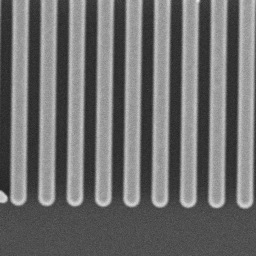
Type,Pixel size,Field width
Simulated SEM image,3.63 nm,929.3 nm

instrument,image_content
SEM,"groups of lines, slits or small figures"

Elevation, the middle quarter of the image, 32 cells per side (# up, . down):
.####...####...####....###....##
.####...####...####....###....##
.####...####...####...####....##
.####...####...####...####....##
.####...####...####...####....##
.####...####...####...####....##
.####...####...####...####....##
.####...####...####...####....##
.####...####...####...####...###
.####...####...####...####...###
.####...####...####...####...###
.####...####...####...####...###
.####...####...####...####...###
.####...####...####...####...###
.####...####...####...####...###
.####...####...####...####...###
.####...####...####...####...###
.####...####...####...####...###
.####...####...####...####...###
.####...####...####...####...###
.####...####...####...####...###
.####...####...####...####...###
.####...####...####...####...###
.####...####...####...####...###
.####...####...####...####...###
.####...####...####...####...###
.####...####...####...####...###
.####...####...####...####...###
.####...####...####...####...###
.####...####...####...####...###
.####...####...####...####...###
.####...####...####...####...###